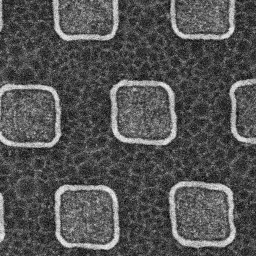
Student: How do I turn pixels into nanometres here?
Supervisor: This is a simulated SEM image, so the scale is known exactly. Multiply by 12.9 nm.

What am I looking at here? raised bodies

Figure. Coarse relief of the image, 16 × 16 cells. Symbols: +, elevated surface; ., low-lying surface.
...++++....++++.
....+++....++++.
................
................
................
+++....+++.....+
++++...++++....+
++++...++++....+
++++...++++....+
................
................
................
....+++....+++..
....+++....+++..
....+++....++++.
................